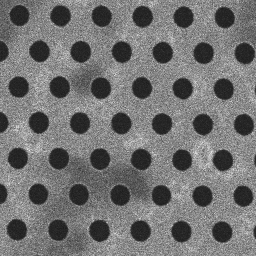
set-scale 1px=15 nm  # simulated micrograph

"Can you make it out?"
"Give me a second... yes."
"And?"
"a regular array of holes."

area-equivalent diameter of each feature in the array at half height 0.315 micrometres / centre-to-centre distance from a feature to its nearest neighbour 612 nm